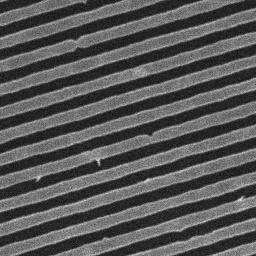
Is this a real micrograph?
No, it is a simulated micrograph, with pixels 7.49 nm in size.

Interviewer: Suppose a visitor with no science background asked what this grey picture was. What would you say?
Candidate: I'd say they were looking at parallel lines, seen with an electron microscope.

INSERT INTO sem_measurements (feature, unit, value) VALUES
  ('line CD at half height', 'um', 0.0799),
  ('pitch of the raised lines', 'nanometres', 168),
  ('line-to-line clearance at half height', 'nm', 87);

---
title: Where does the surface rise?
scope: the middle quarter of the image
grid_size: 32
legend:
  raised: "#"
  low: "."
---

#########..........#########....
######..........##########......
##..........##########..........
.........#########...........###
......#########..........#######
..##########..........#########.
#######............#########....
#####..........#########........
#..........#########...........#
........##########..........####
.....#########...........#######
..#########..........##########.
#########.........#########.....
#####..........#########........
#..........##########..........#
........##########..........####
.....#########..........########
.#########............########..
#######..........##########.....
####..........#########.........
#..........#########..........##
.......##########..........#####
....#########...........########
.#########..........#########...
#######..........#########......
###...........#########.........
..........#########...........##
........########..........######
...###########.........#########
#########...........#########...
######...........#########......
###..........#########..........